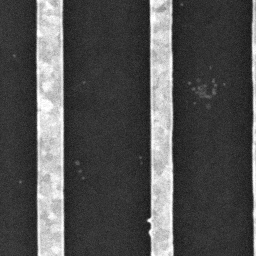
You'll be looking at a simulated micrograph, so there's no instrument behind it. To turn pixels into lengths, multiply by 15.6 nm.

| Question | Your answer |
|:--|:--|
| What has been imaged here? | one or a few lines or trenches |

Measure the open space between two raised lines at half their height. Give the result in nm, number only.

1310